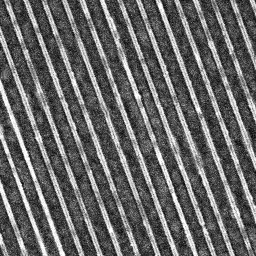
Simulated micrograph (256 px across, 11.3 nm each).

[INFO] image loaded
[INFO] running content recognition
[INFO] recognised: parallel lines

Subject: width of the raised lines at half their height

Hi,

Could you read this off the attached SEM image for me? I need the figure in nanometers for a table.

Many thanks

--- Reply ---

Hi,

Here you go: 41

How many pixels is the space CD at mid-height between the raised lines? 13.8